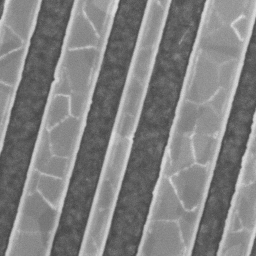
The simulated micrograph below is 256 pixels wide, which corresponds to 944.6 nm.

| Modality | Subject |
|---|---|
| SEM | one or a few lines or trenches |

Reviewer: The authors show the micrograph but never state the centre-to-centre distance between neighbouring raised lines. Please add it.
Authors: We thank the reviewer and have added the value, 243 nanometres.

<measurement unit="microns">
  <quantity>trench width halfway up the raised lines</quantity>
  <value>0.125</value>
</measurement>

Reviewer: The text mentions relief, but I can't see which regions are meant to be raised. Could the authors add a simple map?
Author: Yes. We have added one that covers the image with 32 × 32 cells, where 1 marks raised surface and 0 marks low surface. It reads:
01111000011111100001100000111111
01111000011111000011100000111111
11110000011111000011100001111111
11110000011111000011000001111110
11110000111110000011000001111110
11110000111110000111000001111110
11100000111110000110000011111110
11100000111110000110000011111100
11100001111100001110000011111100
11000001111100001110000111111100
11000001111100001100000111111000
11000011111000001100000111111000
11000011111000011100000111111000
10000011111000011100001111111000
10000011111000011000001111110000
10000111110000011000001111110000
10000111110000111000011111110000
00000111110000110000011111110001
00000111110000110000011111100001
00001111100001110000011111100001
00001111100001110000111111100011
00001111100001100000111111000011
00011111000001100000111111000011
00011111000011100000111111000011
00011111000011100001111111000111
00011111000011000001111110000111
00111110000011000001111110000111
00111110000111000001111110000111
00111110000111000011111110001111
00111110000110000011111100001111
01111100001110000011111100001110
01111100001110000111111100011110